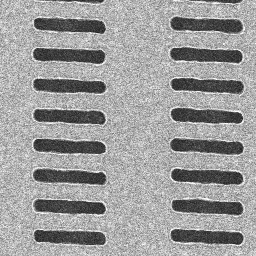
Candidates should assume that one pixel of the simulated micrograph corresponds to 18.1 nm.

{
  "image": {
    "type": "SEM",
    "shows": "a regular array of holes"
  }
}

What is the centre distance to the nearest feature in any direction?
545 nm